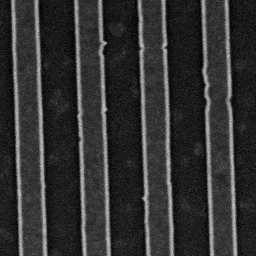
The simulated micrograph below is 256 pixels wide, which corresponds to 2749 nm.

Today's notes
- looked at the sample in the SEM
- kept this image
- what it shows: one or a few lines or trenches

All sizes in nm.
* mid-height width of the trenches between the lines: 430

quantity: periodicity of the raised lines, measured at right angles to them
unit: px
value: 63.4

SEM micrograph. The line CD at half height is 258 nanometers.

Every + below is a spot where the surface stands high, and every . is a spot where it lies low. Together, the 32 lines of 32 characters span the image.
..+++.....++......++.....+++....
..+++.....++......++.....+++....
..+++.....++......++.....+++....
..+++.....+++.....++......++....
..+++.....+++.....+++.....++....
..+++.....+++.....+++.....++....
..+++.....+++.....+++.....+++...
..+++.....+++.....+++.....+++...
..+++.....+++.....+++.....+++...
..+++.....+++.....+++.....+++...
..+++.....+++.....+++.....+++...
..+++.....+++.....+++.....+++...
..+++.....+++.....+++.....+++...
..+++.....+++.....+++.....+++...
..+++.....+++.....+++.....+++...
..+++.....+++.....+++.....+++...
..+++.....+++.....+++.....+++...
..+++.....+++.....+++.....+++...
..+++.....+++.....+++.....+++...
..+++.....+++.....+++.....+++...
..+++.....+++.....+++.....+++...
..+++.....+++.....+++.....+++...
..+++.....+++.....+++.....+++...
..+++.....+++.....+++.....+++...
..+++.....+++.....+++.....+++...
..+++.....+++.....+++.....+++...
...++.....+++.....+++.....+++...
...++.....+++.....+++.....+++...
...+++....+++.....+++.....+++...
...+++.....++......++......++...
...+++.....++......++.....+++...
...+++.....++......++.....+++...